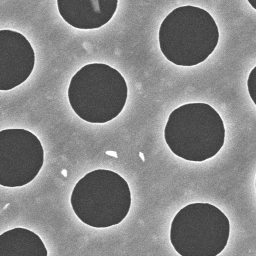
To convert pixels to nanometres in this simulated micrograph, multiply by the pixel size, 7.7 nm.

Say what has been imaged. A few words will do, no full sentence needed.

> holes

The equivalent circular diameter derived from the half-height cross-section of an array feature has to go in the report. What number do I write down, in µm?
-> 0.461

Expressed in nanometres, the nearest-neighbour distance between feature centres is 774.